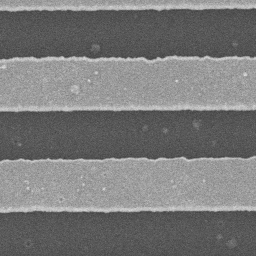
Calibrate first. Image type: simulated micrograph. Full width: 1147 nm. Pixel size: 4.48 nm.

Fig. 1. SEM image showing lines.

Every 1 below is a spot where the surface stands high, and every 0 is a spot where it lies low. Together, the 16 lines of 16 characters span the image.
1111111111111111
0000000000000000
0000000000000000
0000000000000000
1111111111111111
1111111111111111
1111111111111111
0000000000000000
0000000000000000
0000000000000000
1111111111111111
1111111111111111
1111111111111111
0000000000000000
0000000000000000
0000000000000000